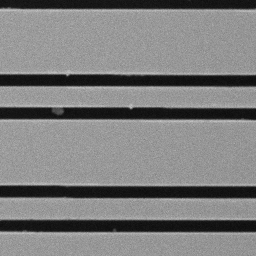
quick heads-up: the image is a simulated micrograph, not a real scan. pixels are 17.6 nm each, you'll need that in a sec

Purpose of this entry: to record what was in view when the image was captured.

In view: lines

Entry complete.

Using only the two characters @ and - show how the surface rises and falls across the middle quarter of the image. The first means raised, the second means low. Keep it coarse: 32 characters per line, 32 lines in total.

@@@@@@@@@@@@@@@@@@@@@@@@@@@@@@@@
@@@@@@@@@@@@@@@@@@@@@@@@@@@@@@@@
@@-------------------@@@@@@@@@@@
--------------------------------
--------------------------------
--------------------------------
@@@@@@@@@@@@@@@@@@@@@@@@@@@@@@@@
@@@@@@@@@@@@@@@@@@@@@@@@@@@@@@@@
@@@@@@@@@@@@@@@@@@@@@@@@@@@@@@@@
@@@@@@@@@@@@@@@@@@@@@@@@@@@@@@@@
@@@@@@@@@@@@@@@@@@@@@@@@@@@@@@@@
--------------------------------
--------------------------------
--------------------------------
@@@@@@@@@@@@@@@@@@@@@@@@@@@@@@@@
@@@@@@@@@@@@@@@@@@@@@@@@@@@@@@@@
@@@@@@@@@@@@@@@@@@@@@@@@@@@@@@@@
@@@@@@@@@@@@@@@@@@@@@@@@@@@@@@@@
@@@@@@@@@@@@@@@@@@@@@@@@@@@@@@@@
@@@@@@@@@@@@@@@@@@@@@@@@@@@@@@@@
@@@@@@@@@@@@@@@@@@@@@@@@@@@@@@@@
@@@@@@@@@@@@@@@@@@@@@@@@@@@@@@@@
@@@@@@@@@@@@@@@@@@@@@@@@@@@@@@@@
@@@@@@@@@@@@@@@@@@@@@@@@@@@@@@@@
@@@@@@@@@@@@@@@@@@@@@@@@@@@@@@@@
@@@@@@@@@@@@@@@@@@@@@@@@@@@@@@@@
@@@@@@@@@@@@@@@@@@@@@@@@@@@@@@@@
@@@@@@@@@@@@@@@@@@@@@@@@@@@@@@@@
@@@@@@@@@@@@@@@@@@@@@@@@@@@@@@@@
@@@@@@@@@@@@@@@@@@@@@@@@@@@@@@@@
--------------------------------
--------------------------------